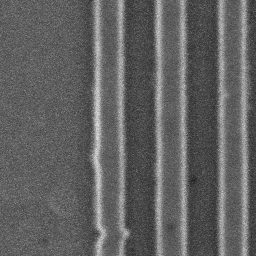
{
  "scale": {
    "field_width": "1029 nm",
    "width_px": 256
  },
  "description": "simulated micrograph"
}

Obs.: one or a few lines or trenches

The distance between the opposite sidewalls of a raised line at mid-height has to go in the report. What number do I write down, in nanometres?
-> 96.9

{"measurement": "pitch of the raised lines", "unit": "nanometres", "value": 248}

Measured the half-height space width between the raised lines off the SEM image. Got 37.1 pixels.